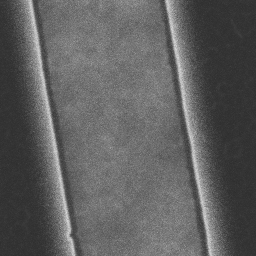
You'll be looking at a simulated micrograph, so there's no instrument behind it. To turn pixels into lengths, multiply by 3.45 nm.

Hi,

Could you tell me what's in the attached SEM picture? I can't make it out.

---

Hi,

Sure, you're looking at one or a few lines or trenches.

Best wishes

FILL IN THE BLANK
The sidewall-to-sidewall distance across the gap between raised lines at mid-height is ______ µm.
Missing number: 0.461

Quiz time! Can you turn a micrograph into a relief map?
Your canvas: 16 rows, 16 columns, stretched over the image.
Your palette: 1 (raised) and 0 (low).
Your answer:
1100000000111111
1100000000011111
1100000000011111
1110000000011111
1110000000011111
1110000000011111
1110000000011111
1110000000001111
1110000000001111
1111000000001111
1111000000001111
1111000000001111
1111000000000111
1111000000000111
1111000000000111
1111100000000111